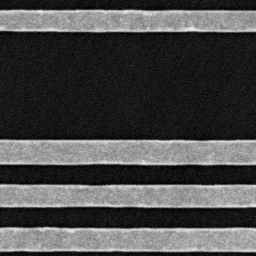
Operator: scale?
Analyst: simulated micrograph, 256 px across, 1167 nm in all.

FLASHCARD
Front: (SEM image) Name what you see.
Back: wiring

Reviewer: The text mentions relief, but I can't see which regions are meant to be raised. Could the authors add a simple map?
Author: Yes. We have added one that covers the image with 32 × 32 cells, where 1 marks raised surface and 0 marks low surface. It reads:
00000000000000000000000000000000
11111111111111111111111111111111
11111111111111111111111111111111
11111111111111111111111111111111
00000000000000000000000000000000
00000000000000000000000000000000
00000000000000000000000000000000
00000000000000000000000000000000
00000000000000000000000000000000
00000000000000000000000000000000
00000000000000000000000000000000
00000000000000000000000000000000
00000000000000000000000000000000
00000000000000000000000000000000
00000000000000000000000000000000
00000000000000000000000000000000
00000000000000000000000000000000
00000000000000000000000000000000
11111111111111111111111111111111
11111111111111111111111111111111
00000000000000000000000000000000
00000000000000000000000000000000
00000000000000000000000000000000
11111111111111111111111111111111
11111111111111111111111111111111
11111111111111111111111111111111
00000000000000000000000000000000
00000000000000000000000000000000
00000110000000000000000000000000
11111111111111111111111111111111
11111111111111111111111111111111
00000000000000000000000000000000